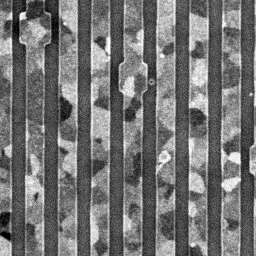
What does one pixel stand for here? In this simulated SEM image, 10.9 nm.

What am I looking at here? wiring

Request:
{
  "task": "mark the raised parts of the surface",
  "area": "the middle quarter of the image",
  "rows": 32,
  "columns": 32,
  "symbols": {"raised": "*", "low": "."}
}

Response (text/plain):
***....****...*******..*****....
***....****...*******..*****....
***....****...*******..*****....
***....****...*******..*****....
***....****...*******..*****....
***....****...*******..*****....
***....****...******...*****...*
***....****....*****...*****...*
***....****....****....*****...*
***....****....*****...*****...*
***....****....*****...*****...*
***....****....*****...*****...*
***....****....*****...*****...*
***....****....*****...*****...*
***....****....*****...*****...*
***....****....*****...*****...*
***....****....*****...*****...*
***....****....****....*****...*
***....****....****....*****...*
***....****....****....*****...*
***....****....****....*****...*
***....****....****....*****...*
***....****....****....*****...*
***....****....****....*****....
***....****....****....*****....
***....****....****....*****....
***....****....****....*****...*
***....****....****....*****...*
***....****....****....*****...*
***....****....****....*****...*
***....****....****....*****...*
***....****....****....*****...*